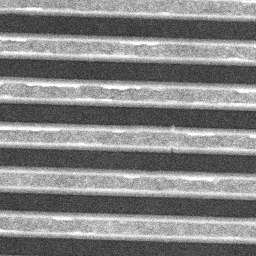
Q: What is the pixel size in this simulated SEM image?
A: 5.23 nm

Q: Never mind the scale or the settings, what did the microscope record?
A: parallel lines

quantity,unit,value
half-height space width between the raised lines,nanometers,123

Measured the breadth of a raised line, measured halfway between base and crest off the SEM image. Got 110 nm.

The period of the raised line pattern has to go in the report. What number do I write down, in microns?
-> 0.233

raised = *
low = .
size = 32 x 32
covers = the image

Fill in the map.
********************************
.....***************************
................................
................................
***.............................
********************************
********************************
..................**************
................................
................................
****************................
********************************
********************************
................................
................................
................................
******************************..
********************************
.............*******************
................................
................................
***********.....................
********************************
********************************
..........................******
................................
................................
****************************....
********************************
........************************
................................
................................